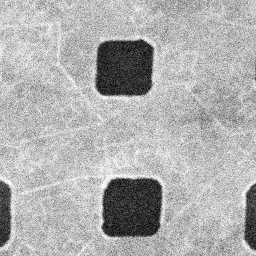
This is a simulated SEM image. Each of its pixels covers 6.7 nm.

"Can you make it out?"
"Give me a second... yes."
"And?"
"holes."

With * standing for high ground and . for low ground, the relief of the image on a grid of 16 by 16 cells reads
****************
****************
*******..*******
******....******
******....******
******...*******
****************
****************
****************
****************
****************
*******...******
.*****....*****.
.*****....*****.
.******...*****.
****************